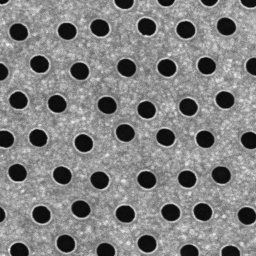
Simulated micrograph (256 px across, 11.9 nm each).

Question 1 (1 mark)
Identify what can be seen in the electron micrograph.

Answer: a regular array of holes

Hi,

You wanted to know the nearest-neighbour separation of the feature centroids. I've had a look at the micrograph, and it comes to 447 nm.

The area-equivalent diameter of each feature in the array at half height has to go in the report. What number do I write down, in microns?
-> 0.218